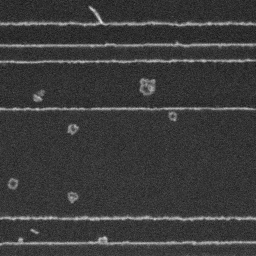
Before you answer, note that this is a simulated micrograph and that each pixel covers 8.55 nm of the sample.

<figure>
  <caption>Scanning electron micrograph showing lines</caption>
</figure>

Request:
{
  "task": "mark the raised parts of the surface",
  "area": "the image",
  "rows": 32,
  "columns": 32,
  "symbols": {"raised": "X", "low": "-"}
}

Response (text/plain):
XXXXXXXXXXXXXXXXXXXXXXXXXXXXXXXX
XXXXXXXXXXXXXXXXXXXXXXXXXXXXXXXX
XXXXXXXXXXXXXXXXXXXXXXXXXXXXXXXX
--------------------------------
--------------------------------
--------------------------------
XXXXXXXXXXXXXXXXXXXXXXXXXXXXXXXX
XXXXXXXXXXXXXXXXXXXXXXXXXXXXXXXX
--------------------------------
--------------------------------
------------------X-------------
--------------------------------
--------------------------------
--------------------------------
XXXXXXXXXXXXXXXXXXXXXXXXXXXXXXXX
XXXXXXXXXXXXXXXXXXXXXXXXXXXXXXXX
XXXXXXXXXXXXXXXXXXXXXXXXXXXXXXXX
XXXXXXXXXXXXXXXXXXXXXXXXXXXXXXXX
XXXXXXXXXXXXXXXXXXXXXXXXXXXXXXXX
XXXXXXXXXXXXXXXXXXXXXXXXXXXXXXXX
XXXXXXXXXXXXXXXXXXXXXXXXXXXXXXXX
XXXXXXXXXXXXXXXXXXXXXXXXXXXXXXXX
XXXXXXXXXXXXXXXXXXXXXXXXXXXXXXXX
XXXXXXXXXXXXXXXXXXXXXXXXXXXXXXXX
XXXXXXXXXXXXXXXXXXXXXXXXXXXXXXXX
XXXXXXXXXXXXXXXXXXXXXXXXXXXXXXXX
XXXXXXXXXXXXXXXXXXXXXXXXXXXXXXXX
--------------------------------
--------------------------------
--------------------------------
XXXXXXXXXXXXXXXXXXXXXXXXXXXXXXXX
XXXXXXXXXXXXXXXXXXXXXXXXXXXXXXXX